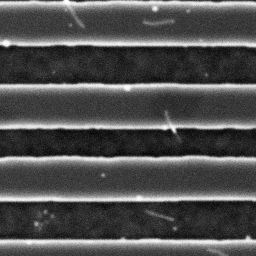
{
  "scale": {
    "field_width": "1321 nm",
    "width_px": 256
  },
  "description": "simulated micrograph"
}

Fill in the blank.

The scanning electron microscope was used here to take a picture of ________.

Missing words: lines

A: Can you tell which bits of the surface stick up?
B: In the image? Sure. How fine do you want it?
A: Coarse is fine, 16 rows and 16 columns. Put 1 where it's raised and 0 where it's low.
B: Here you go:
1111111111111111
1111111111111111
1111111111111111
0000000000000000
0000000000000000
1111111111111111
1111111111111111
1111111111111111
0000000000000000
0000000000000000
1111111111111111
1111111111111111
1111111111100000
0000000000000000
0000000000000000
1111111111111111